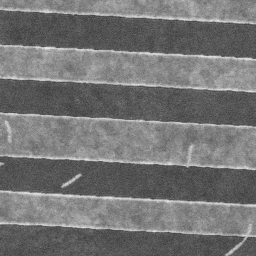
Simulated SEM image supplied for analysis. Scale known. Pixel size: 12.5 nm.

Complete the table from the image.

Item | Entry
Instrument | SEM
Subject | lines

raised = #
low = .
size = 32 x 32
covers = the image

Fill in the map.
################################
.....###########################
.........................#######
................................
................................
................................
################................
################################
################################
################################
................################
................................
................................
................................
#######.........................
#########################.......
################################
################################
################################
.###############################
....................############
................................
................................
................................
########........................
###########################.....
################################
################################
...........#####################
..............................##
................................
................................